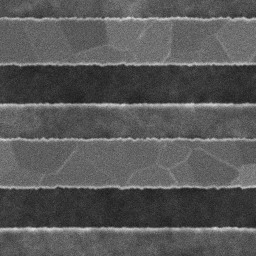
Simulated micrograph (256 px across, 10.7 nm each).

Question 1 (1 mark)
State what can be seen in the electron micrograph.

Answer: lines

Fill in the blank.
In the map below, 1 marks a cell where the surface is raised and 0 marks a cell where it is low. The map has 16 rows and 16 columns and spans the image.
1111111111111111
1111111111111111
1111111111111111
1111111111111111
0000000000000000
0000000000000000
0000000000000000
1111111111111111
1111111111111111
1111111111111111
1111111111111111
1111111111111111
0000000000000000
0000000000000000
1111111111111111
1111111111111111